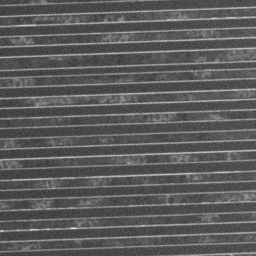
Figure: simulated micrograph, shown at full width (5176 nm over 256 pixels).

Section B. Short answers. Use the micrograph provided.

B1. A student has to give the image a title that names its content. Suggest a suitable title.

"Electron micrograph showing parallel lines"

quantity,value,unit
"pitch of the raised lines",414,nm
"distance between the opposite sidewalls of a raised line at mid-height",0.22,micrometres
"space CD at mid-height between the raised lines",192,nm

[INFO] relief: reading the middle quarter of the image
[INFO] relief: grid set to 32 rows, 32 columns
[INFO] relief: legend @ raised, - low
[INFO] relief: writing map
----------------@@@@@@@@@@@@@@@@
@@@@@@@@@@@@@@@@@@@@@@@@@@@@@@@@
@@@@@@@@@@----------------------
--------------------------------
--------------------------@@@@@@
@@@@@@@@@@@@@@@@@@@@@@@@@@@@@@@@
@@@@@@@@@@@@@@@@@@@@@@@@@@@@@@@@
@@@@@@@@@@@@@-------------------
--------------------------------
------------------------------@@
--@@@@@@@@@@@@@@@@@@@@@@@@@@@@@@
@@@@@@@@@@@@@@@@@@@@@@@@@@@@@@@@
@@@@@@@@@@@@@@@-----------------
--------------------------------
-------------------------------@
----@@@@@@@@@@@@@@@@@@@@@@@@@@@@
@@@@@@@@@@@@@@@@@@@@@@@@@@@@@@@@
@@@@@@@@@@@@@@@@@@--------------
--------------------------------
--------------------------------
-------@@@@@@@@@@@@@@@@@@@@@@@@@
@@@@@@@@@@@@@@@@@@@@@@@@@@@@@@@@
@@@@@@@@@@@@@@@@@@@@------------
--------------------------------
--------------------------------
----------@@@@@@@@@@@@@@@@@@@@@@
@@@@@@@@@@@@@@@@@@@@@@@@@@@@@@@@
@@@@@@@@@@@@@@@@@@@@@@@@@@@@----
--------------------------------
--------------------------------
-----------------@@@@@@@@@@@@@@@
@@@@@@@@@@@@@@@@@@@@@@@@@@@@@@@@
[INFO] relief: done